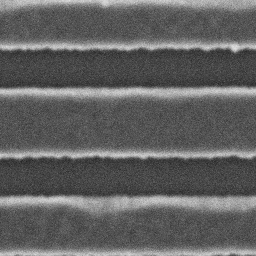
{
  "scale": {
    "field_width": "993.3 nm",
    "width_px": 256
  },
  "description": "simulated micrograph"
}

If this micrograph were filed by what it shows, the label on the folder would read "lines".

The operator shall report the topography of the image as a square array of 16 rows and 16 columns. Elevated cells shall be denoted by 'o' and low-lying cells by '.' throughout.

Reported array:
oooooooooooooooo
oooooooooooooooo
oooooooooooooooo
................
................
................
oooooooooooooooo
oooooooooooooooo
oooooooooooooooo
oooooooooooooooo
................
................
ooooo...oooo....
oooooooooooooooo
oooooooooooooooo
oooooooooooooooo